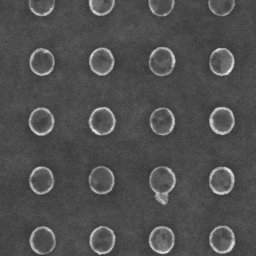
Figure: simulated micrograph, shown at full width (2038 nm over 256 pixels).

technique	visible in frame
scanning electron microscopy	a regular array of raised bodies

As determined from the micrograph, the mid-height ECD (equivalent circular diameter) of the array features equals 26.4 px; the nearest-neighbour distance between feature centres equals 469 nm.